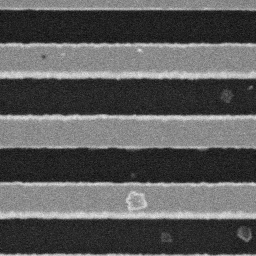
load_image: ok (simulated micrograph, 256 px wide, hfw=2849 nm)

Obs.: lines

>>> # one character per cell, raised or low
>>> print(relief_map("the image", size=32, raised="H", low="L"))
HHHHHHHHHHHHHHHHHHHHHHHHHHHHHHHH
LLLLLLLLLLLLLLLLLLLLLLLLLLLLLLLL
LLLLLLLLLLLLLLLLLLLLLLLLLLLLLLLL
LLLLLLLLLLLLLLLLLLLLLLLLLLLLLLLL
LLLLLLLLLLLLLLLLLLLLLLLLLLLLLLLL
HHHHHHHHHLHHHHHHHHHHHLLHHHLHHHHH
HHHHHHHHHHHHHHHHHHHHHHHHHHHHHHHH
HHHHHHHHHHHHHHHHHHHHHHHHHHHHHHHH
HHHHHHHHHHHHHHHHHHHHHHHHHHHHHHHH
HHHHHHHHHHHHHHHHHHHHHHHHHHHHHHHH
LLLLLLLLLLLLLLLLLLLLLLLLLLLLLLLL
LLLLLLLLLLLLLLLLLLLLLLLLLLLLLLLL
LLLLLLLLLLLLLLLLLLLLLLLLLLLLLLLL
LLLLLLLLLLLLLLLLLLLLLLLLLLLLLLLL
HHHHHHHHHHHHHHHHHHHHHHHHHHHHHHHH
HHHHHHHHHHHHHHHHHHHHHHHHHHHHHHHH
HHHHHHHHHHHHHHHHHHHHHHHHHHHHHHHH
HHHHHHHHHHHHHHHHHHHHHHHHHHHHHHHH
LLLLLLLLLLLLLLLLLLLLLLLLLLLLLLLL
LLLLLLLLLLLLLLLLLLLLLLLLLLLLLLLL
LLLLLLLLLLLLLLLLLLLLLLLLLLLLLLLL
LLLLLLLLLLLLLLLLLLLLLLLLLLLLLLLL
LLLLLLLLLLLLLLLLLLLLLLLLLLLLLLLL
HHHHHHHHHHHHHHHHHHHHHHHHHHHHHHHH
HHHHHHHHHHHHHHHHHHHHHHHHHHHHHHHH
HHHHHHHHHHHHHHHHHHHHHHHHHHHHHHHH
HHHHHHHHHHHHHHHHHHHHHHHHHHHHHHHH
LLLLLLLLLLLLLLLLLLLLLLLLLLLLLLLL
LLLLLLLLLLLLLLLLLLLLLLLLLLLLLLLL
LLLLLLLLLLLLLLLLLLLLLLLLLLLLLLLL
LLLLLLLLLLLLLLLLLLLLLLLLLLLLLLLL
LLLLLLLLLLLLLLLLLLLLLLLLLLLLLLLL